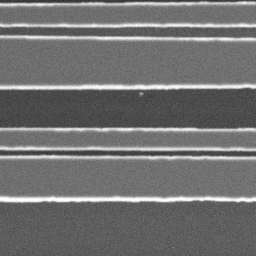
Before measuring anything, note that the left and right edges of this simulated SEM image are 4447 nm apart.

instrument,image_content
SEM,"lines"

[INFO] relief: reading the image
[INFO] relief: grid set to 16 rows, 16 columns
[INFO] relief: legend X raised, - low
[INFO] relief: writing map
XXXXXXXXXXXXXXXX
XXXXXXXXXXXXXXXX
XXXXXXXXXXXXXXXX
XXXXXXXXXXXXXXXX
XXXXXXXXXXXXXXXX
----------------
----------------
----------------
XXXXXXXXXXXXXXXX
XXXXXXXXXXXXXXXX
XXXXXXXXXXXXXXXX
XXXXXXXXXXXXXXXX
----------X-----
----------------
----------------
----------------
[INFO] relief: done